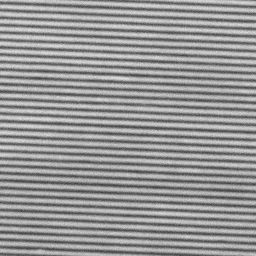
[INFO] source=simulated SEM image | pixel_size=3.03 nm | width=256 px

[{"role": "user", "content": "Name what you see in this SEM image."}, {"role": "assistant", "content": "parallel lines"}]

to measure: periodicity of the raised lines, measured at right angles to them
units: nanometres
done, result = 22.4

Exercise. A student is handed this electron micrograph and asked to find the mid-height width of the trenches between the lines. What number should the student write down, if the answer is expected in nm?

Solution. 8.7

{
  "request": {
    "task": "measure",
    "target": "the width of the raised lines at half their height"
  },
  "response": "0.0144 µm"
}